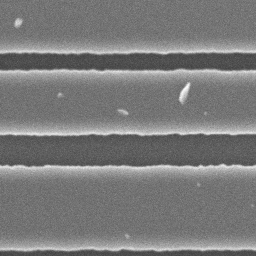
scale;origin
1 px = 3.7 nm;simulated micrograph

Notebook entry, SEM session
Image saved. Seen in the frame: lines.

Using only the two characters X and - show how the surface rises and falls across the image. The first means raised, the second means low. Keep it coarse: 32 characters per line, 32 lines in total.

XXXXXXXXXXXXXXXXXXXXXXXXXXXXXXXX
XXXXXXXXXXXXXXXXXXXXXXXXXXXXXXXX
XXXXXXXXXXXXXXXXXXXXXXXXXXXXXXXX
XXXXXXXXXXXXXXXXXXXXXXXXXXXXXXXX
XXXXXXXXXXXXXXXXXXXXXXXXXXXXXXXX
XXXXXXXXXXXXXXXXXXXXXXXXXXXXXXXX
X-X--XXXXXXXXXXXX-XXXX-XX--XX-XX
--------------------------------
--------------------------------
XXXXXXXXXXXXXXXXXXXXXXXXXXXXXXXX
XXXXXXXXXXXXXXXXXXXXXXXXXXXXXXXX
XXXXXXXXXXXXXXXXXXXXXXXXXXXXXXXX
XXXXXXXXXXXXXXXXXXXXXXXXXXXXXXXX
XXXXXXXXXXXXXXXXXXXXXXXXXXXXXXXX
XXXXXXXXXXXXXXXXXXXXXXXXXXXXXXXX
XXXXXXXXXXXXXXXXXXXXXXXXXXXXXXXX
XXXXXXXXXXXXXXXXXXXXXXXXXXXXXXXX
--------------------------------
--------------------------------
--------------------------------
--------------------------------
XXXXXXXXXXXXXXXXXXXXXXXXXXXXXXXX
XXXXXXXXXXXXXXXXXXXXXXXXXXXXXXXX
XXXXXXXXXXXXXXXXXXXXXXXXXXXXXXXX
XXXXXXXXXXXXXXXXXXXXXXXXXXXXXXXX
XXXXXXXXXXXXXXXXXXXXXXXXXXXXXXXX
XXXXXXXXXXXXXXXXXXXXXXXXXXXXXXXX
XXXXXXXXXXXXXXXXXXXXXXXXXXXXXXXX
XXXXXXXXXXXXXXXXXXXXXXXXXXXXXXXX
XXXXXXXXXXXXXXXXXXXXXXXXXXXXXXXX
XXXXXXXXXXXXXXXXXXXXXXXXXXXXXXXX
--------------------------------